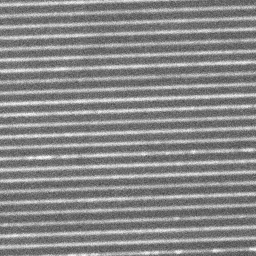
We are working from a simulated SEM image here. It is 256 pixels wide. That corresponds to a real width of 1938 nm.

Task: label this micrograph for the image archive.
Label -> parallel lines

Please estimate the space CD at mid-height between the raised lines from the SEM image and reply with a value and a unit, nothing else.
9.5 pixels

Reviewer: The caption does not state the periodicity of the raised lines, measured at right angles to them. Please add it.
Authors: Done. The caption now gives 11 pixels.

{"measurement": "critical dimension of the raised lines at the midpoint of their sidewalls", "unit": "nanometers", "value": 14.2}